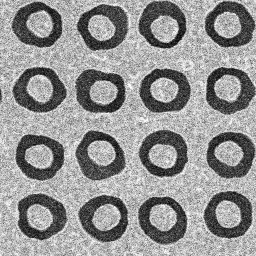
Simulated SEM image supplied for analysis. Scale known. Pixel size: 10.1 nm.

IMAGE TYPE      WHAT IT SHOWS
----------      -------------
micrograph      a regular array of ring-shaped grooves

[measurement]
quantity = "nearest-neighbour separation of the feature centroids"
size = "606 nanometers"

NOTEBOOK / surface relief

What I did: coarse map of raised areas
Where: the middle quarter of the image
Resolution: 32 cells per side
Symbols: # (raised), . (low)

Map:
################################
#####...##############......####
####.........########.........##
###............#####....#......#
###.....###....####....####....#
###....######..####...#######...
###....######...###...#######...
.##....######..####...######....
###....######..####....#####...#
###.....####...#####.....#.....#
####..........######..........##
#####........########........###
################################
################################
################################
################################
########################..######
#####......###########.......###
#####.......########..........##
####...####..#######..........##
###...######..#####....###.....#
###...#######..####...######...#
###...#######..###...#######...#
###....######..####..#######...#
###.....####....###...######...#
####...........#####....###...##
####...........######.........##
#####.........#######.......####
#####......#####################
################################
################################
################################